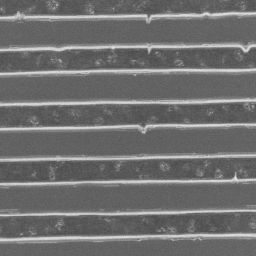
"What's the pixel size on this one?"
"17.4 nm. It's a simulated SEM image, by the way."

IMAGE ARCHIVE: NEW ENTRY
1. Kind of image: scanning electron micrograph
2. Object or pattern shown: parallel lines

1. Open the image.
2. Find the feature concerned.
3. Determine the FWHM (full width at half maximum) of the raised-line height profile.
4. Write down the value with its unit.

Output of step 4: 546 nm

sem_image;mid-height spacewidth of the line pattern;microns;0.416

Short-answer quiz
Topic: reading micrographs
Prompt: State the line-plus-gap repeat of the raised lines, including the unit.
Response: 959 nanometers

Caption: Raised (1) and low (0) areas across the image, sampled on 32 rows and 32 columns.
00000000000000000000000000000000
00000000000000000000000000000000
11111111111111111111111111111111
11111111111111111111111111111111
11111111111111111111111111111111
11111111111111111111111111111111
00000000000000000000000000000000
00000000000000000000000000000000
00000000000000000000000000000000
11111111111111111111111111111111
11111111111111111111111111111111
11111111111111111111111111111111
11111111111111111111111111111111
00000000000000000000000000000000
00000000000000000000000000000000
00000000000000000000000000000000
11111111111111111111111111111111
11111111111111111111111111111111
11111111111111111111111111111111
11111111111111111111111111110000
00000000000000000000000000000000
00000000000000000000000000000000
00000000000000000000000000000111
11111111111111111111111111111111
11111111111111111111111111111111
11111111111111111111111111111111
11111111111111111111111100000000
00000000000000000000000000000000
00000000000000000000000000000000
00000000000000000000000011111111
11111111111111111111111111111111
11111111111111111111111111111111